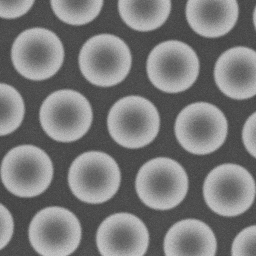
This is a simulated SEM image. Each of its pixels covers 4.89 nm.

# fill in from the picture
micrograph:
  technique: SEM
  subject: an array of small figures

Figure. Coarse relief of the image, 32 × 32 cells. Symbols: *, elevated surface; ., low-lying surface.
****..*******..******..*******..
***....*****...******..*******..
........***....******..*******..
.................***....*****...
..*****.....**............*.....
..******...*****....***.........
.*******..******...*****....****
..******..******..*******..*****
..*****...******..*******..*****
...***.....*****...******..*****
............**.....*****...*****
**.....***...........*......****
***...*****....***..............
***..******...*****....****.....
***..*******..******..******...*
**...******..*******..******...*
*.....*****...******..******..**
.......**.....*****...******..**
..***..................****....*
.*****....****..................
******...******...****..........
*******..******..******...*****.
******...******..******...******
.*****...******..******..*******
..**......****...******..*******
..................****....*****.
*....****..................***..
**..******...****......*........
**..******..******...*****.....*
*...******..*******..******...**
*...******..******...******..***
.....****...******...******..***